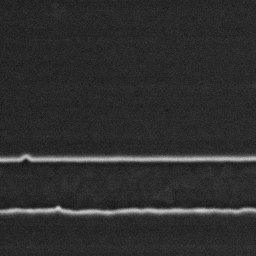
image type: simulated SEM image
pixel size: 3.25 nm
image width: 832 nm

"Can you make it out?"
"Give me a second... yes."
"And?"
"one or a few lines or trenches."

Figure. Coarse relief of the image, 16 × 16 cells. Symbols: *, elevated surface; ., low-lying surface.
****************
****************
****************
****************
****************
****************
****************
****************
****************
****************
................
................
................
****************
****************
****************